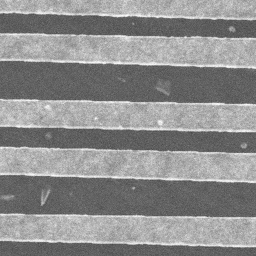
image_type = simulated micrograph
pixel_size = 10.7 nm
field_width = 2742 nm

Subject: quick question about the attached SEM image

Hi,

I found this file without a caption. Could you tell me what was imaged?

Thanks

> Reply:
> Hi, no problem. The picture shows lines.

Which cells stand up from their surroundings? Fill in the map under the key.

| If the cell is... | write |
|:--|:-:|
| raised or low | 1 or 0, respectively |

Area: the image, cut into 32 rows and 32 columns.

11111111111111111111111111111111
11111111111111111111111111111111
00000000000000000000000000000000
00000000000000000000000000000000
11111111111000000000000000000000
11111111111111111111111111111111
11111111111111111111111111111111
11111111111111111111111111111111
00000000000000000000000000000001
00000000000000000000000000000000
00000000000000000000000000000000
00000000000000000000000000000000
00000000000000000000000000000000
11111111111111111111111111111111
11111111111111111111111111111111
11111111111111111111111111111111
00000000000000000000000000000000
00000000000000000000000000000000
11110000000000000000000000000000
11111111111111111111111111111111
11111111111111111111111111111111
11111111111111111111111111111111
00000000000000000000000011111111
00000000000000000000000000000000
00000000000000000000000000000000
00000000000000000000000000000000
00000000000000000000000000000000
11111111111111111111111111111111
11111111111111111111111111111111
11111111111111111111111111111111
00000000000000000000111111111111
00000000000000000000000000000000